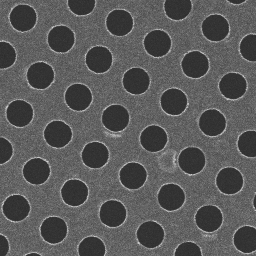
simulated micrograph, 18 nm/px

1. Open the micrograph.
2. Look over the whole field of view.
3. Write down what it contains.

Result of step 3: a regular array of holes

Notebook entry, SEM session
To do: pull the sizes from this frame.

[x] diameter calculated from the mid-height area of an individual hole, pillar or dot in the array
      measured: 476 nm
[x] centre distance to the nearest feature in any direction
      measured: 42.3 px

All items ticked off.